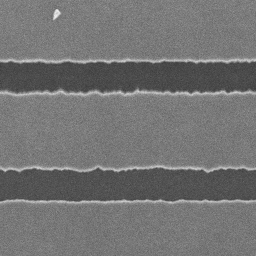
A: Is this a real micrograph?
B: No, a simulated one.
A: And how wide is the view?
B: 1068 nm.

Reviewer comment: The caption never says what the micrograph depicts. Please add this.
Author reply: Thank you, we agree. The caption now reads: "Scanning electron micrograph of lines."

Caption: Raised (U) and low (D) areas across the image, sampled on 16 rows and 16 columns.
UUUUUUUUUUUUUUUU
UUUUUUUUUUUUUUUU
UUUUUUUUUUUUUUUU
UUUUUUUUUUUUUUUU
DDDDDDDDDDDDDDDD
DDDDDDDDDDDDDDDD
UUUUUUUUUUUUUUUU
UUUUUUUUUUUUUUUU
UUUUUUUUUUUUUUUU
UUUUUUUUUUUUUUUU
UUUUUUUUUUUUUUUU
DDDDDDDDDDDDDDDD
DDDDDDDDDDDDDDDD
UUUUUUUUUUUUUUUU
UUUUUUUUUUUUUUUU
UUUUUUUUUUUUUUUU